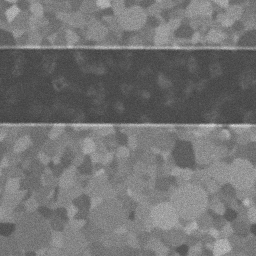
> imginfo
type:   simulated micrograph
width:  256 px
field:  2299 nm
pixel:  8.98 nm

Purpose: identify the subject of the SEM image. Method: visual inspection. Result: one or a few lines or trenches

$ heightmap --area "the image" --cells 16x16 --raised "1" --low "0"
1111111111111111
1111111111111111
1111111111111111
0000000000000000
0000000000000000
0000000000000000
0000000000000000
0000000000000000
1111111111111111
1111111111111111
1111111111111111
1111111111111111
1111111111111111
1111111111111111
1111111111111111
1111111111111111